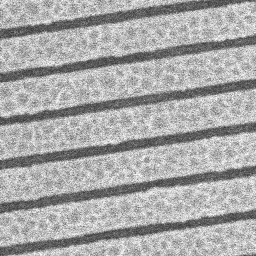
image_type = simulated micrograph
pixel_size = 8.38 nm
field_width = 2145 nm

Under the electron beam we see parallel lines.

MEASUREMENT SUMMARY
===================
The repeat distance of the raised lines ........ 361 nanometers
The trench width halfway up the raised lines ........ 0.0839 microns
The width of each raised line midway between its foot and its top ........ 275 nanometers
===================